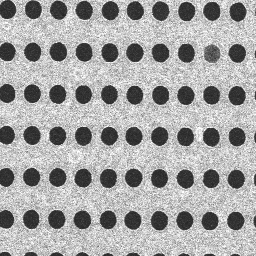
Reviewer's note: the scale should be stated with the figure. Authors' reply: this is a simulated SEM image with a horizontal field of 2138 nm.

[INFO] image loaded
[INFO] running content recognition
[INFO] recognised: a regular array of holes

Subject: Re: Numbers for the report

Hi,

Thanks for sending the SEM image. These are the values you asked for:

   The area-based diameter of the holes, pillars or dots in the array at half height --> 0.151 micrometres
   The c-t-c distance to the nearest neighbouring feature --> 0.211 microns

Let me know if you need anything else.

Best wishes